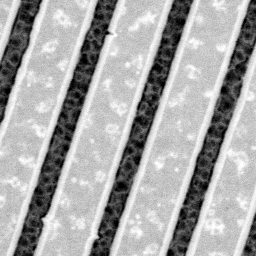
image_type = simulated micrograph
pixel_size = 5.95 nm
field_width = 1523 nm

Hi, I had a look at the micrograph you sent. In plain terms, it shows one or a few lines or trenches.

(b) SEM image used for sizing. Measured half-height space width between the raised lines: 25.7 px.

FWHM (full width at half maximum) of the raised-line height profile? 0.28 um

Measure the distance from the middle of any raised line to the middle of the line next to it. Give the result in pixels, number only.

72.2